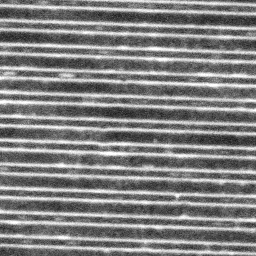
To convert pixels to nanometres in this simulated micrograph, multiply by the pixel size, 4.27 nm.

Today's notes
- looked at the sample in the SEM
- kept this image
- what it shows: parallel lines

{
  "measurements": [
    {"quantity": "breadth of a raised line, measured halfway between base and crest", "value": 65.5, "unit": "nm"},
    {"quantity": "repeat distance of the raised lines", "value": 0.102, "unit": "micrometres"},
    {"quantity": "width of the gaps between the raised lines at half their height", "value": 36.8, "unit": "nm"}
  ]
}